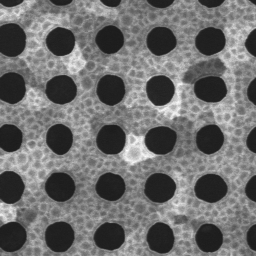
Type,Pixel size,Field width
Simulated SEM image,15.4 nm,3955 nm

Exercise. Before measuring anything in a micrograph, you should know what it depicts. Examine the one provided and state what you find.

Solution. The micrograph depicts a regular array of holes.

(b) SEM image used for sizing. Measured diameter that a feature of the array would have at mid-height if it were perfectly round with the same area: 464 nm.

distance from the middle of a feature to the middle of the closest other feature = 0.75 µm